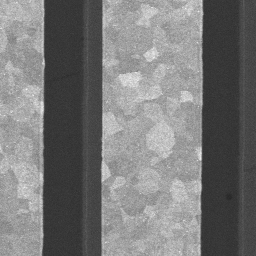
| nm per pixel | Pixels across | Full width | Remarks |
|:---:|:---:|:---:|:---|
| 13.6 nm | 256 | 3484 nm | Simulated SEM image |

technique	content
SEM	lines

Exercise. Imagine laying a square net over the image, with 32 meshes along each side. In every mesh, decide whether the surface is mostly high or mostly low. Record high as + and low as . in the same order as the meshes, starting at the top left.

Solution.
+++++........++++++++++++.......
++++++.......++++++++++++.......
+++++........++++++++++++.......
+++++........++++++++++++.......
+++++........++++++++++++.......
+++++........++++++++++++.......
+++++........++++++++++++.......
++++++.......++++++++++++.......
++++++.......++++++++++++.......
+++++........++++++++++++.......
+++++........++++++++++++.......
+++++........++++++++++++.......
+++++........++++++++++++.......
+++++........++++++++++++.......
+++++........++++++++++++.......
+++++........++++++++++++.......
+++++........++++++++++++.......
+++++........++++++++++++.......
+++++........++++++++++++.......
+++++........++++++++++++.......
+++++........++++++++++++.......
+++++........++++++++++++.......
+++++........++++++++++++.......
+++++........++++++++++++.......
+++++........++++++++++++.......
+++++........++++++++++++.......
+++++........++++++++++++.......
+++++........++++++++++++.......
+++++........++++++++++++.......
+++++........++++++++++++.......
+++++........++++++++++++.......
+++++........++++++++++++.......